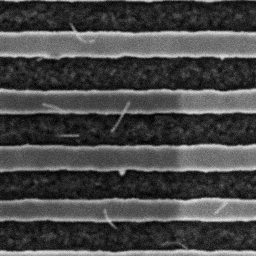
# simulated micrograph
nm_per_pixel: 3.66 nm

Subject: lines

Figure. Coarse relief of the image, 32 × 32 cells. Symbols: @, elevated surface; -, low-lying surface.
--------------------------------
--------------------------------
--------------------------------
--------------------------------
@@@@@@@@@@@@@@@@@@@@@@@@@@@@@@@@
@@@@@@@@@@@@@@@@@@@@@@@@@@@@@@@@
@@@@@@@@@@@@@@@@@@@@@@@@@@@@@@@@
--------------------------------
--------------------------------
--------------------------------
--------------------------------
@@@@@@@@@@@@@@@@@@@@@@@@@@@@@@@@
@@@@@@@@@@@@@@@@@@@@@@@@@@@@@@@@
@@@@@@@@@@@@@@@@@@@@@@@@@@@@@@@@
--------------------------------
--------------------------------
--------------------------------
--------------------------------
@@@@@@@@@@@@@@@@@@@@@@@@@@@@@@@@
@@@@@@@@@@@@@@@@@@@@@@@@@@@@@@@@
@@@@@@@@@@@@@@@@@@@@@@@@@@@@@@@@
--------------------------------
--------------------------------
--------------------------------
--------------------------------
@@@@@@@@@@@@@@@@@@@@@@@@@@@@@@@@
@@@@@@@@@@@@@@@@@@@@@@@@@@@@@@@@
@-@@@-@@@@@@@@@@@@@@@@---@@@@@@@
--------------------------------
--------------------------------
--------------------------------
@@@@@@@@@@@@@@@@@@@@@@@@@@@@@@@@